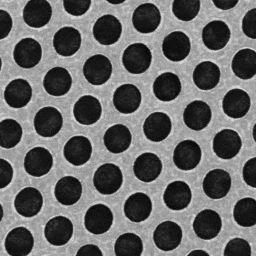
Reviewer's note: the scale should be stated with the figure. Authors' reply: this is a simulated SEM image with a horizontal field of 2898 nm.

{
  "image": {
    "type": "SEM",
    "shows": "a regular array of holes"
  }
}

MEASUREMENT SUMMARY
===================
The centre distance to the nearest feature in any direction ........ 465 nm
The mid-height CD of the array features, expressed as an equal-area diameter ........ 344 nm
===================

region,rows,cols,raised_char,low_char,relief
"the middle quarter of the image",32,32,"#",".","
#####.......###.......##########
.####.......####.....###########
..###.......#####..#####....####
..###......############......###
..####.....###########.......###
..######.#####....####.......###
.############......###.......###
############.......####......###
####....####.......####.....####
###......###.......######.######
##.......####......############.
##........###.....############..
##.......######.######....####..
###......############......###..
###.....############.......###..
############...#####.......####.
###########.....####.......#####
##########.......###......######
##....####.......####.....######
.......###.......######.#####...
.......###......############....
.......####.....###########.....
.......############....####.....
.......###########......###.....
#.....###########.......###.....
###.#####....####........###....
########......###.......#####...
#######........##.......########
...####........###.....#########
....###........#####..#####...##
.....###......############.....#
.....###......###########.......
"